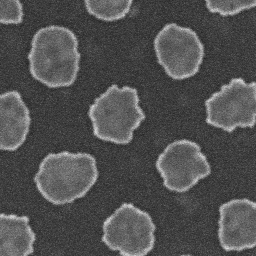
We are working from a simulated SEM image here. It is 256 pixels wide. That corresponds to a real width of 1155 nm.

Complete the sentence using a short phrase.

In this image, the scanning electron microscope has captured raised bodies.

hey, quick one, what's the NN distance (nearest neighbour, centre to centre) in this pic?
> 376 nm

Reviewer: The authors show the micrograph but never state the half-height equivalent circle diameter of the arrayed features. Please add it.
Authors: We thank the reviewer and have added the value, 239 nm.